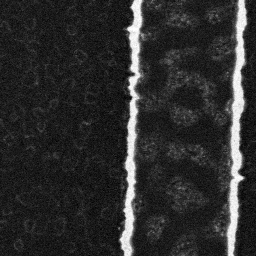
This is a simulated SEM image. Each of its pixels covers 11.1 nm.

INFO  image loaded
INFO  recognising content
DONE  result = one or a few lines or trenches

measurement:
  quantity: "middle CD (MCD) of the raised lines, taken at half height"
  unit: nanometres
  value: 1170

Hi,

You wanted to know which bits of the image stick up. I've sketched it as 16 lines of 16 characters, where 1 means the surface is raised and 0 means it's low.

0000000001111110
0000000001111110
0000000011111110
0000000011111110
0000000011111110
0000000011111110
0000000011111110
0000000011111110
0000000011111110
0000000011111110
0000000011111110
0000000011111110
0000000011111110
0000000011111110
0000000011111100
0000000011111100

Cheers